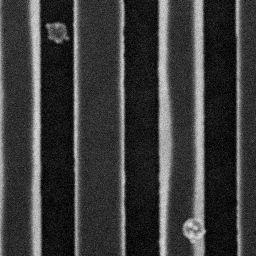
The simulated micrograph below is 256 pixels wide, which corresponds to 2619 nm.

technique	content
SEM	lines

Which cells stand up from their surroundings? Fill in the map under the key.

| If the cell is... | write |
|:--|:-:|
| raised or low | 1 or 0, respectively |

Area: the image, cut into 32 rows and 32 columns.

11111000011111100000111110000011
11111000011111100000111110000011
11111000011111100000111110000011
11111000011111100000111110000011
11111000011111100000111110000011
11111000011111100000111110000011
11111000011111100000111110000011
11111000011111100000111110000011
11111000011111100000111110000011
11111000011111100000111110000011
11111000011111100000111110000011
11111000011111100000111110000011
11111000011111100000111110000011
11111000011111100000111110000011
11111000011111100000111110000011
11111000011111100000111110000011
11111000011111100000011110000011
11111000011111100000011110000011
11111000011111100000011110000011
11111000011111100000011110000011
11111000011111100000011110000011
11111000011111100000111110000011
11111000011111100000111110000011
11111000011111100000111110000011
11111000011111100000111110000011
11111000011111100000111110000011
11111000011111110000111110000011
11111000011111110000111110000011
11111000011111110000111111000011
11111000011111110000111110000011
11111000011111110000111110000011
11111000011111110000111110000011